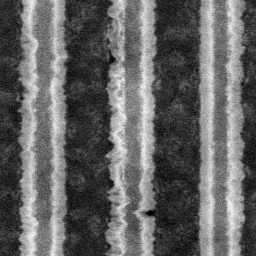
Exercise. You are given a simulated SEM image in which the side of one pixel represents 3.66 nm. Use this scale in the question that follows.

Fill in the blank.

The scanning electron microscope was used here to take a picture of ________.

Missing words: one or a few lines or trenches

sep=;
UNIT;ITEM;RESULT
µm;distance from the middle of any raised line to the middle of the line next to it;0.325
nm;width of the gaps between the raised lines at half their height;213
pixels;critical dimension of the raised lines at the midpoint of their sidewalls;30.4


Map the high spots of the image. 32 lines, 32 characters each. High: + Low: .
...++++........++++.......+++...
...+++++.......++++.......+++...
...++++........+++........+++...
...++++........++++.......+++...
...++++........++++.......++++..
....+++........+++........+++...
....+++.......++++........++++..
....+++........+++........+++...
....+++........+++........++++..
....+++.......++++........++++..
....+++........+++........+++...
....+++.......++++........+++...
...++++.......+++++.......+++...
...++++.......+++++.......+++...
....+++........++++.......+++...
....+++.......++++........+++...
....+++.......++++........+++...
....+++.......+++++.......+++...
...++++.......++++........+++...
....+++.......++++........+++...
...++++.......+++++.......+++...
...++++.......++++........+++...
...++++.......++++........+++...
...++++.......++++........+++...
....+++........+++........+++...
....+++........+++........+++...
...++++........+++........++++..
...++++........++++.......+++...
....+++........++++.......+++...
...++++.......++++........+++...
...++++.......+++++.......+++...
...++++........++++.......++++..